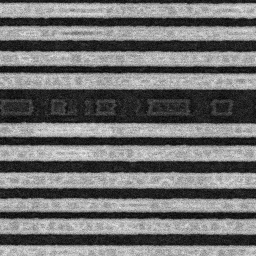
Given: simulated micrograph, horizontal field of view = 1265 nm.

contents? parallel lines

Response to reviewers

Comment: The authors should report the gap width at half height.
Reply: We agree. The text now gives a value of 58.6 nm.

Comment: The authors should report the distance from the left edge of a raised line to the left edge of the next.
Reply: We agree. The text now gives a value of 118 nm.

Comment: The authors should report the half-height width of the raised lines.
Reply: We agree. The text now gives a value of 0.0636 um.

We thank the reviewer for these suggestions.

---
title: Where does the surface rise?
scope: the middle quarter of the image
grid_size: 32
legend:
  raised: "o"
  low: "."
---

................................
................................
................................
oooooooooooooooooooooooooooooooo
oooooooooooooooooooooooooooooooo
oooooooooooooooooooooooooooooooo
................................
................................
................................
........oooo.........oooooooooo.
........ooooo.........ooooooooo.
........oooo.........oooooooooo.
...........................o.oo.
................................
................................
oooooooooooooooooooooooooooooooo
oooooooooooooooooooooooooooooooo
oooooooooooooooooooooooooooooooo
................................
................................
................................
oooooooooooooooooooooooooooooooo
oooooooooooooooooooooooooooooooo
oooooooooooooooooooooooooooooooo
................................
................................
................................
oo......oooo.oo.o.oo.o..oooo....
oooooooooooooooooooooooooooooooo
oooooooooooooooooooooooooooooooo
oo.ooooooooooooooooooooooooooooo
................................